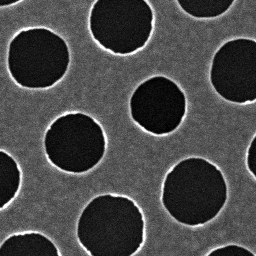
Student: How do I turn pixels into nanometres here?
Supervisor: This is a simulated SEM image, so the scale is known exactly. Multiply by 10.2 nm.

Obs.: holes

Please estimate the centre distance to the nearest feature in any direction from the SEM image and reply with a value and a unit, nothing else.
934 nanometers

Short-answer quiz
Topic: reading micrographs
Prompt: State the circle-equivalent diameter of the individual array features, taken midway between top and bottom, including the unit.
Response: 616 nm